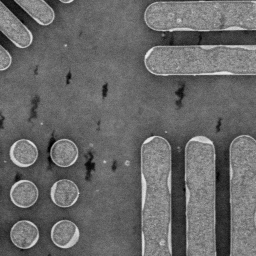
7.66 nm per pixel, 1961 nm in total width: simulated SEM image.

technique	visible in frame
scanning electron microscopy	groups of lines, slits or small figures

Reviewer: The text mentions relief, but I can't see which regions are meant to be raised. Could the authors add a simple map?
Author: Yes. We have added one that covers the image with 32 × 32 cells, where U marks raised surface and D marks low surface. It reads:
DDUUUUDDDDDDDDDDDDDUUUUUUUUUUUUU
UDDUUUUDDDDDDDDDDDUUUUUUUUUUUUUU
UUDDUUUDDDDDDDDDDDUUUUUUUUUUUUUU
UUUDDDDDDDDDDDDDDDDUUUUUUUUUUUUU
DUUUDDDDDDDDDDDDDDDDDDDDDDDDDDDD
DDUUDDDDDDDDDDDDDDDDDDDDDDDDDDDD
UDDDDDDDDDDDDDDDDDDUUUUUUUUUUUUU
UDDDDDDDDDDDDDDDDDUUUUUUUUUUUUUU
UDDDDDDDDDDDDDDDDDUUUUUUUUUUUUUU
DDDDDDDDDDDDDDDDDDDDDDDDDDDDDDDD
DDDDDDDDDDDDDDDDDDDDDDDDDDDDDDDD
DDDDDDDDDDDDDDDDDDDDDDDDDDDDDDDD
DDDDDDDDDDDDDDDDDDDDDDDDDDDDDDDD
DDDDDDDDDDDDDDDDDDDDDDDDDDDDDDDD
DDDDDDDDDDDDDDDDDDDDDDDDDDDDDDDD
DDDDDDDDDDDDDDDDDDDDDDDDDDDDDDDD
DDDDDDDDDDDDDDDDDDDDDDDDDDDDDDDD
DDDDDDDUUDDDDDDDDDDUUDDDUUDDDUUU
DDUUDDDUUUDDDDDDDDUUUDDUUUUDDUUU
DUUUUDUUUUDDDDDDDDUUUDDUUUUDDUUU
DDDUDDDUUDDDDDDDDDUUUDDUUUUDDUUU
DDDDDDDDDDDDDDDDDDUUUDDUUUUDDUUU
DDDDDDDDDDDDDDDDDDUUUDDUUUUDDUUU
DDUUUDDUUUDDDDDDDDUUUDDUUUUDDUUU
DUUUUDDUUUDDDDDDDDUUUDDUUUUDDUUU
DDUUDDDUUDDDDDDDDDUUUDDUUUUDDUUU
DDDDDDDDDDDDDDDDDDUUUDDUUUUDDUUU
DDDDDDDDDDDDDDDDDDUUUDDUUUUDDUUU
DDUUUDDUUUDDDDDDDDUUUDDUUUUDDUUU
DUUUUDDUUUDDDDDDDDUUUDDUUUUDDUUU
DDUUDDDUUDDDDDDDDDUUUDDUUUUDDUUU
DDDDDDDDDDDDDDDDDDUUUDDUUUUDDUUU